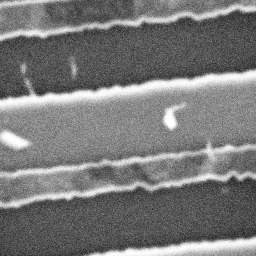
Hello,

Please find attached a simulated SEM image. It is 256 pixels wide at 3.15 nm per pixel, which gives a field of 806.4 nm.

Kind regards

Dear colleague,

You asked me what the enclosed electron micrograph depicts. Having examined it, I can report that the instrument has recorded lines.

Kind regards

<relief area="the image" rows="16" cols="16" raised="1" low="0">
1111111111111111
1111111000000000
0000000000000000
0000000000000000
0000000000000000
0000000011111111
1111111111111111
1111111111111111
1111111111111111
1111111111111111
1111111111111111
1111111111100000
1100000000000000
0000000000000000
0000000000000000
0000000000011111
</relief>